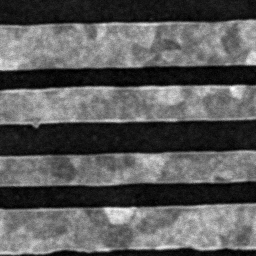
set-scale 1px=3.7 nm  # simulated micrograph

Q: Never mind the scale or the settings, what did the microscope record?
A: one or a few lines or trenches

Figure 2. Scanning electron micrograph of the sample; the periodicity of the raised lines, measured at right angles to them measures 226 nm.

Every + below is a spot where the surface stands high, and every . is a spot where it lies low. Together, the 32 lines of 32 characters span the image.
................................
................................
................................
++++++++++++++++++++++++++++++++
++++++++++++++++++++++++++++++++
++++++++++++++++++++++++++++++++
++++++++++++++++++++++++++++++++
++++++++++++++++++++++++++++++++
++++++++........................
................................
................................
++++++++++++++++++++++++++++++++
++++++++++++++++++++++++++++++++
++++++++++++++++++++++++++++++++
++++++++++++++++++++++++++++++++
....+...........................
................................
................................
................................
......++...+++++++++++++++++++++
++++++++++++++++++++++++++++++++
++++++++++++++++++++++++++++++++
++++++++++++++++++++++++++++++.+
................................
................................
................................
++++++++++++++++++++++++++++++++
++++++++++++++++++++++++++++++++
++++++++++++++++++++++++++++++++
++++++++++++++++++++++++++++++++
++++++++++++++++++++++++++++++++
++++++.....+....................